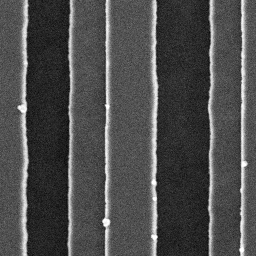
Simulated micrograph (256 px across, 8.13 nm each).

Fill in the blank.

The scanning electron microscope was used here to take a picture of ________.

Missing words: lines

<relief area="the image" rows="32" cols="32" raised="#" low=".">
###......##########.......######
###......##########.......######
###......###########......######
###......##########........#####
###......##########........#####
###......##########.......######
###......##########.......######
###......##########.......######
###......##########.......######
###......##########.......######
###......###########......######
###......###########......######
###......###########......######
###......###########......######
###......##########.......######
###......##########.......######
###......##########.......######
###......##########.......######
###......##########.......######
###......##########.......######
###......##########.......######
###......##########.......######
###......##########.......######
###......##########.......######
###......###########......######
###......##########.......######
###......###########......######
###......##########.......######
###......##########.......######
###......###########......######
###......##########.......######
###......##########.......######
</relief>